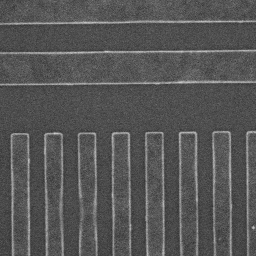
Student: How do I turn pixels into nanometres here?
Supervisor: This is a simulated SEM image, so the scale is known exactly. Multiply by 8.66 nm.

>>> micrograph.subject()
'groups of lines, slits or small figures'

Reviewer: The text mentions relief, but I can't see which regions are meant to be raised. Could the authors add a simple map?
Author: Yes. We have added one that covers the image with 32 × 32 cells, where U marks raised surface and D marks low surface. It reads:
UUUUUUUUUUUUUUUUUUUUUUUUUUUUUUUU
UUUUUUUUUUUUUUUUUUUUUUUUUUUUUUUU
UUUUUUUUUUUUUUUUUUUUUUUUUUUUUUUU
DDDDDDDDDDDDDDDDDDDDDDDDDDDDDDDD
DDDDDDDDDDDDDDDDDDDDDDDDDDDDDDDD
DDDDDDDDDDDDDDDDDDDDDDDDDDDDDDDD
DDDDDDDDDDDDDDDDDDDDDDDDDUUUUUUU
UUUUUUUUUUUUUUUUUUUUUUUUUUUUUUUU
UUUUUUUUUUUUUUUUUUUUUUUUUUUUUUUU
UUUUUUUUUUUUUUUUUUUUUUUUUUUUUUUU
UUUUUUUUUUUUUDDDDDDDDDDDDDDDDDDD
DDDDDDDDDDDDDDDDDDDDDDDDDDDDDDDD
DDDDDDDDDDDDDDDDDDDDDDDDDDDDDDDD
DDDDDDDDDDDDDDDDDDDDDDDDDDDDDDDD
DDDDDDDDDDDDDDDDDDDDDDDDDDDDDDDD
DDDDDDDDDDDDDDDDDDDDDDDDDDDDDDDD
DDDDDDDDDDDDDDDDDDDDDDDDDDDUDDDU
DUUUDDUUDDUUDDUUDDUUDDUUUDDUUDDU
DUUUDDUUDDUUDDUUDDUUDDDUUDDUUDDU
DUUUDDUUDDUUDDUUDDUUDDDUUDDUUDDU
DDUUDDUUDDUUDDUUDDUUDDDUUDDUUDDU
DDUUDDUUDDUUDDUUDDUUDDDUUDDUUDDU
DDUUDDUUDDUUDDUUDDUUDDDUUDDUUDDU
DDUUDDUUDDUUDDUUDDUUDDDUUDDUUDDU
DDUUDDUUDDUUDDUUDDUUDDDUUDDUUDDU
DDUUDDUUDDUUDDUUDDUUDDDUUDDUUDDU
DDUUDDUUDDUUDDUUDDUUDDDUUDDUUDDU
DDUUDDUUDDUUDDUUDDUUDDDUUDDUUDDU
DDUUDDUUDDUUDDUUDDUUDDDUUDDUUDDU
DDUUDDUUDDUUDDUUDDUUDDDUUDDUUDDU
DDUUDDUUDDUUDDUUDDUUDDDUUDDUUDDU
DDUUDDUUDDUUDDUUDDUUDDDUUDDUUDDU